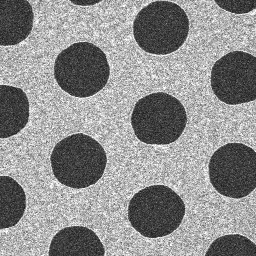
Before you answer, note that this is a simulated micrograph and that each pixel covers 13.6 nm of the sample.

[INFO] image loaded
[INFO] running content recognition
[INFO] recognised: holes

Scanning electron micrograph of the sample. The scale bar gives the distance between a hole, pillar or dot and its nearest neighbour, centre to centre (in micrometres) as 1.24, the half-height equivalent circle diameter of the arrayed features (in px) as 55.3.